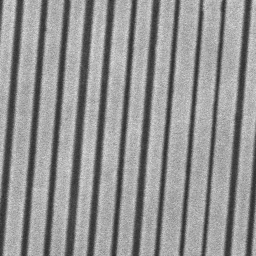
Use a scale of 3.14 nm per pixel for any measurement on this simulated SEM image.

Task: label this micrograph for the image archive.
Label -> parallel lines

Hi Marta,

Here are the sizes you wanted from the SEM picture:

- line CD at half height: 15.8 pixels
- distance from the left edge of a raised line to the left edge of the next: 70.6 nm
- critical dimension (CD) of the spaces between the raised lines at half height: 20.3 nm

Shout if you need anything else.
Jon